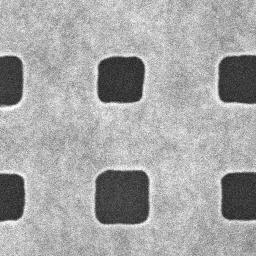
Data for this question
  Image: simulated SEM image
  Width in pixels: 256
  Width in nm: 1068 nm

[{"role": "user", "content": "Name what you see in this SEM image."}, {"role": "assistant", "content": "holes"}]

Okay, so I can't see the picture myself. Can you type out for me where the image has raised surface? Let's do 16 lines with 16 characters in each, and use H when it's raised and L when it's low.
HHHHHHHHHHHHHHHH
HHHHHHHHHHHHHHHH
HHHHHHHHHHHHHHHH
LHHHHHHHHHHHHHLL
LHHHHHLLLHHHHHLL
LHHHHHLLLHHHHHLL
LHHHHHHHHHHHHHHL
HHHHHHHHHHHHHHHH
HHHHHHHHHHHHHHHH
HHHHHHHHHHHHHHHH
HHHHHHHHHHHHHHHH
LHHHHHLLLHHHHHLL
LLHHHHLLLHHHHHLL
LHHHHHLLLHHHHHLL
HHHHHHHHHHHHHHHH
HHHHHHHHHHHHHHHH